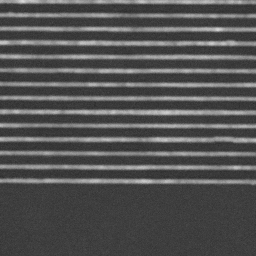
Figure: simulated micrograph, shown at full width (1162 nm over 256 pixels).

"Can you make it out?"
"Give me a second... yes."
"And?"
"parallel lines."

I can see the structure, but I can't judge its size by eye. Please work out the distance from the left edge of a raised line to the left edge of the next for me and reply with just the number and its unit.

0.0627 µm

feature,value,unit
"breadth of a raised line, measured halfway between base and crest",3.63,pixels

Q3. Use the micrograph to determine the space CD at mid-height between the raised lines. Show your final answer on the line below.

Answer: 0.0443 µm